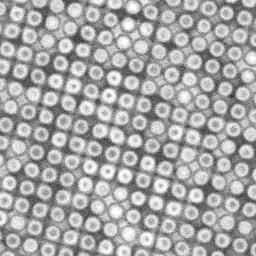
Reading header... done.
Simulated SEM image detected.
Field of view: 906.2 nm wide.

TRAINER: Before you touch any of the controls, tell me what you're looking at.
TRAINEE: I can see a regular array of raised bodies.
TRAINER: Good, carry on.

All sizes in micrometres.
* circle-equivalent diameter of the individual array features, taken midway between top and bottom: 0.0421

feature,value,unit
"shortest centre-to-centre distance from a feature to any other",64.3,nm